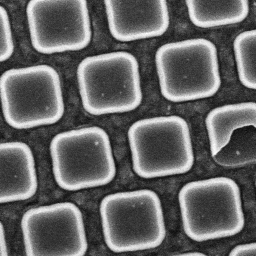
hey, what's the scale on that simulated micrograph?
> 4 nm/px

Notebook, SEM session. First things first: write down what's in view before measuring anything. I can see raised bodies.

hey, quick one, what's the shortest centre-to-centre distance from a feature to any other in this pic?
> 317 nanometres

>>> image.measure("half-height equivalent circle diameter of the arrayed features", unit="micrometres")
0.243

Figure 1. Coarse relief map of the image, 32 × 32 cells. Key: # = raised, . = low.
....######...########...#######.
....#######...#######...#######.
#...#######...#######...######..
#...#######...#######...........
#...#######....###............##
#...#######............###....##
#...................#######...##
...........######...#######...##
.....#....#######...#######...##
.######...#######...#######...##
#######...#######...#######....#
#######...#######...#######.....
########..#######...............
.#######...#####............####
.######...................######
..##.............######...######
..........###...#######...###...
.......######...#######...###...
###....#######...#######...#....
####...#######...#######........
####...#######...#######........
####...#######...#####..........
####...######..............#....
####.....#.............######...
###...........#####....#######..
.............#######...#######..
....######...#######...#######..
...#######...#######...#######..
...#######...#######...#######..
...#######...#######....###.....
...########...#####.............
#...######...................###